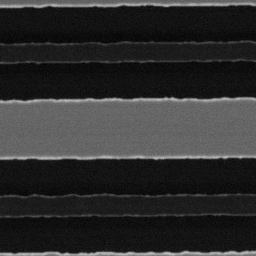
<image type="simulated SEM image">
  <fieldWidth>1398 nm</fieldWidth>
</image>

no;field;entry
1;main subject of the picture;lines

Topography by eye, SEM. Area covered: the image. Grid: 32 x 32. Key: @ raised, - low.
@@@@@@@@@@@@@@@@@@@@@@@@@@@@@@@@
--------------------------------
--------------------------------
--------------------------------
--------------------------------
@@@@@@@@@@@@@@@@@@@@@@@@@@@@@@@@
@@@@@@@@@@@@@@@@@@@@@@@@@@@@@@@@
@@@@@@@@@@@@@@@@@@@@@@@@@@@@@@@@
--------------------------------
--------------------------------
--------------------------------
--------------------------------
----@@@@@@@@@@@@@@@@@@@@@@@@@@@@
@@@@@@@@@@@@@@@@@@@@@@@@@@@@@@@@
@@@@@@@@@@@@@@@@@@@@@@@@@@@@@@@@
@@@@@@@@@@@@@@@@@@@@@@@@@@@@@@@@
@@@@@@@@@@@@@@@@@@@@@@@@@@@@@@@@
@@@@@@@@@@@@@@@@@@@@@@@@@@@@@@@@
@@@@@@@@@@@@@@@@@@@@@@@@@@@@@@@@
@@@@@@@@@@@@@@@@@@@@@@@@@@@@@@@@
--------------------------------
--------------------------------
--------------------------------
--------------------------------
@@@-@@--@@@@@@@@@@@@@@@@@@@@@@@@
@@@@@@@@@@@@@@@@@@@@@@@@@@@@@@@@
@@@@@@@@@@@@@@@@@@@@@@@@@@@@@@@@
--------------------------------
--------------------------------
--------------------------------
--------------------------------
-----------------------@----@@@@